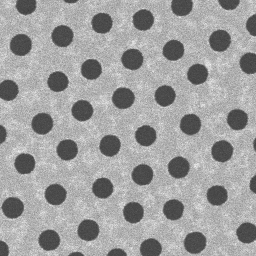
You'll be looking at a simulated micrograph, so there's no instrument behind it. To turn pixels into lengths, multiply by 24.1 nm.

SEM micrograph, a regular array of holes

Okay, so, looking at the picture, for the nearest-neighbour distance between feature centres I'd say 0.941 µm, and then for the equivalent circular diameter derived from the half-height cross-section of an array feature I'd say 525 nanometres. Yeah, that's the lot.